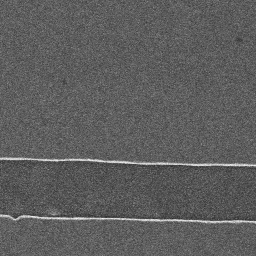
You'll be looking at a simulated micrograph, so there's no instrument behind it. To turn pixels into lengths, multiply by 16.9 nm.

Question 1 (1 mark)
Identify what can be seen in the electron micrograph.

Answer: one or a few lines or trenches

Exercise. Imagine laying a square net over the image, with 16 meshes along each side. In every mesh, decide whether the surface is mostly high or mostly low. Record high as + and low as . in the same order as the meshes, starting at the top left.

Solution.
++++++++++++++++
++++++++++++++++
++++++++++++++++
++++++++++++++++
++++++++++++++++
++++++++++++++++
++++++++++++++++
++++++++++++++++
++++++++++++++++
++++++++++++++++
................
................
................
................
++++++++++++++++
++++++++++++++++